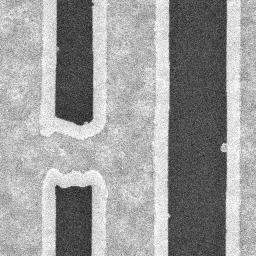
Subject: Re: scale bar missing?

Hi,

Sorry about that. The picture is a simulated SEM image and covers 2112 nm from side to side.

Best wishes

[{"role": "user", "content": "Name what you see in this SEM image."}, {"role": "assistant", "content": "one or a few lines or trenches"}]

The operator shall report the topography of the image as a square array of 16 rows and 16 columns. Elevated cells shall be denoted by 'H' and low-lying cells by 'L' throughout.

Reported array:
HHHLLLHHHHLLLLLH
HHHLLLHHHHLLLLLH
HHHLLLHHHHLLLLLH
HHHLLLHHHHLLLLLH
HHHLLLHHHHLLLLLH
HHHLLLHHHHLLLLLH
HHHLLLHHHHLLLLLH
HHHLLLHHHHLLLLLH
HHHHHHHHHHLLLLLH
HHHHHHHHHHLLLLLH
HHHHHHHHHHLLLLLH
HHHLLLHHHHLLLLLH
HHHLLLHHHHLLLLLH
HHHLLLHHHHLLLLLH
HHHLLLHHHHLLLLLH
HHHLLLHHHHLLLLLH